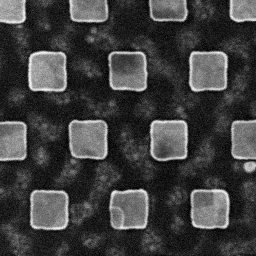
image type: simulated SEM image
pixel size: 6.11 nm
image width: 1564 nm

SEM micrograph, a regular array of raised bodies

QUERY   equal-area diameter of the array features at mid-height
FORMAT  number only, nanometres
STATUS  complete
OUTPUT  250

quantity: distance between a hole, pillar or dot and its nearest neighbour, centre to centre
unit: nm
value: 480